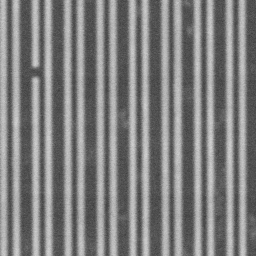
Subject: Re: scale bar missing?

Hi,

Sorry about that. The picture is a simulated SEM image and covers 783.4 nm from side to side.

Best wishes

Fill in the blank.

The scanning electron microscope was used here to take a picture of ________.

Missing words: parallel lines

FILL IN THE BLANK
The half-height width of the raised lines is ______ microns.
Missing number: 0.018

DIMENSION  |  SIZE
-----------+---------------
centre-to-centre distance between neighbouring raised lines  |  49.5 nanometers